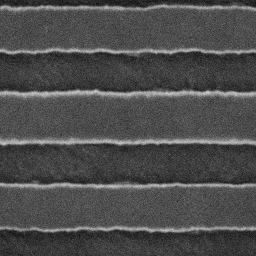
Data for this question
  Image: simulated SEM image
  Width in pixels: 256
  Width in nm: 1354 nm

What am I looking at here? lines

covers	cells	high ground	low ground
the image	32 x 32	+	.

................................
++++++++++++++++++++++++++++++++
++++++++++++++++++++++++++++++++
++++++++++++++++++++++++++++++++
++++++++++++++++++++++++++++++++
++++++++++++++++++++++++++++++++
++++++..+.++.+++++.+++...+++++++
................................
................................
................................
................................
.........++++..........+..+.....
++++++++++++++++++++++++++++++++
++++++++++++++++++++++++++++++++
++++++++++++++++++++++++++++++++
++++++++++++++++++++++++++++++++
++++++++++++++++++++++++++++++++
++++++++++++++++++++++++++++++++
................................
................................
................................
................................
................................
++++++++++++++++++++++++++++++++
++++++++++++++++++++++++++++++++
++++++++++++++++++++++++++++++++
++++++++++++++++++++++++++++++++
++++++++++++++++++++++++++++++++
++++++++++++++++++++++++++++++++
................................
................................
................................